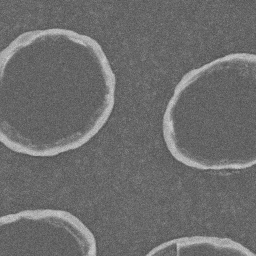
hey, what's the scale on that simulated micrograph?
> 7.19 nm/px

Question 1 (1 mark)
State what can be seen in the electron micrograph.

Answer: raised bodies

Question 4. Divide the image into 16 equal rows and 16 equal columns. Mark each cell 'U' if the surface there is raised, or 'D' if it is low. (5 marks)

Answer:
DDDDDDDDDDDDDDDD
DDDDDDDDDDDDDDDD
DUUUUDDDDDDDDDDD
UUUUUUDDDDDDDDDD
UUUUUUUDDDDDUUUU
UUUUUUUDDDDUUUUU
UUUUUUUDDDDUUUUU
UUUUUUDDDDUUUUUU
UUUUUUDDDDDUUUUU
DDUDDDDDDDDUUUUU
DDDDDDDDDDDDDDDD
DDDDDDDDDDDDDDDD
DDDDDDDDDDDDDDDD
DUUUDDDDDDDDDDDD
UUUUUDDDDDDDDDDD
UUUUUUDDDDDUUUUD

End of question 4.